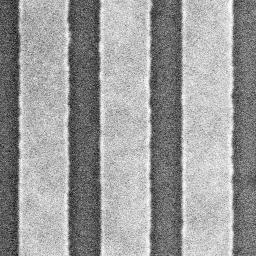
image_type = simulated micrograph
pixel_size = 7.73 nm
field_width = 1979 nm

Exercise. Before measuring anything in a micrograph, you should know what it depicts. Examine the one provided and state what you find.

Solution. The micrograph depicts lines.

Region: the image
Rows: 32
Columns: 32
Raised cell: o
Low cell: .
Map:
...ooooo.....oooooo....oooooo...
...ooooo.....oooooo....oooooo...
...ooooo.....oooooo....oooooo...
...ooooo.....oooooo....oooooo...
...oooooo....oooooo....oooooo...
...ooooo.....oooooo....oooooo...
...ooooo.....oooooo....oooooo...
...ooooo.....oooooo....oooooo...
...ooooo.....oooooo....oooooo...
...ooooo.....oooooo....oooooo...
...ooooo.....oooooo....oooooo...
...ooooo.....oooooo....oooooo...
...ooooo.....oooooo....oooooo...
...ooooo.....oooooo....oooooo...
...ooooo.....oooooo....oooooo...
...ooooo.....oooooo....oooooo...
...ooooo.....oooooo....oooooo...
...ooooo.....oooooo....oooooo...
...ooooo.....oooooo....oooooo...
...ooooo.....oooooo....oooooo...
...ooooo.....oooooo....oooooo...
...ooooo.....oooooo....oooooo...
...ooooo.....oooooo....oooooo...
...ooooo.....oooooo....oooooo...
...ooooo.....oooooo....oooooo...
...ooooo.....oooooo....oooooo...
...ooooo.....oooooo....oooooo...
...ooooo.....oooooo....oooooo...
...ooooo.....oooooo....oooooo...
...ooooo.....oooooo....oooooo...
...ooooo.....oooooo....oooooo...
...ooooo.....oooooo....oooooo...